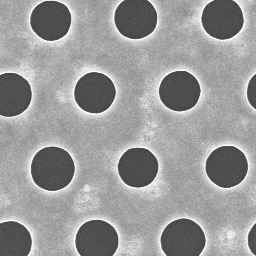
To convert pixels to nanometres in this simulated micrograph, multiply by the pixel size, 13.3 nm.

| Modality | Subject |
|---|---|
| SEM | holes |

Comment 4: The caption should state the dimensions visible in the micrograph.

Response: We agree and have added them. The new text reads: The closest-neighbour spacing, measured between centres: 85.3 px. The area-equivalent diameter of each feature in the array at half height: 554 nanometers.